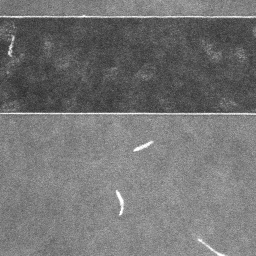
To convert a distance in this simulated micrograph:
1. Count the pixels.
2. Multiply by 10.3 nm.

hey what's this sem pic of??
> one or a few lines or trenches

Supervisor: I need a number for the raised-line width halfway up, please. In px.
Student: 97.7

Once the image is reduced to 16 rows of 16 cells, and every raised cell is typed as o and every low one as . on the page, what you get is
................
oooooooooooooooo
oooooooooooooooo
oooooooooooooooo
oooooooooooooooo
oooooooooooooooo
oooooooooooooooo
................
................
................
................
................
................
................
................
................